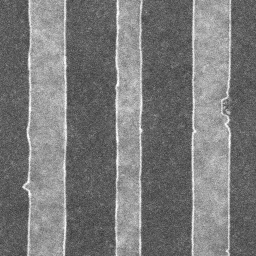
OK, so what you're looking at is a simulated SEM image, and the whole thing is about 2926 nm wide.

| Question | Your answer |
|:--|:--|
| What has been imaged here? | one or a few lines or trenches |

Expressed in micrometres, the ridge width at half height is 0.61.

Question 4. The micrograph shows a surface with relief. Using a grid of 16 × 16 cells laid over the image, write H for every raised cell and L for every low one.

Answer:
HHLLHHHLLHHHLLHH
HHLLHHHLLHHHLLHH
HHLLHHHLLHHHLLHH
HHLLHHHLLHHHLLHH
HHLLHHHLLHHHLLHH
HHLLHHHLLHHHLLHH
HHLLHHHLLHHHLLHH
HHLLHHHLLHHHLLHH
HHLLHHHLLHHHLLHH
HHLLHHHLLHHHLLHH
HHLLHHHLLHHHLLHH
HHLLHHHLLHHHLLHH
HHLLHHHLLHHHLLHH
HHLLHHHLLHHHLLHH
HHLLHHHLLHHHLLHH
HHLLHHHLLHHHLLHH